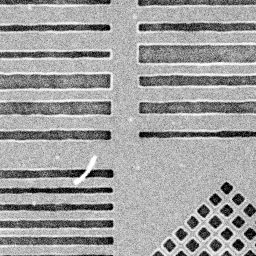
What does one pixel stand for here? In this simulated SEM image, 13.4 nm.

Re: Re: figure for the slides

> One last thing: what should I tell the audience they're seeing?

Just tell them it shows groups of lines, slits or small figures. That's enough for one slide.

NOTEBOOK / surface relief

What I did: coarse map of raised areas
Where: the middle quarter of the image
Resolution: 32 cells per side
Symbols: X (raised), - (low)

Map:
XXXXXXXXXXXXXXXXXXXXXXXXXXXXXXXX
XXXXXXXXXXXXXXXXXXXXXXXXXXXXXXXX
------------XXXXXXXXXXXXXXX--XXX
------------XXXXXXX-------------
------------XXXXXXX-------------
------------XXXXXXX-------------
XXXXXXXXXXXXXXXXXXXXXXXXXXXXXXXX
XXXXXXXXXXXXXXXXXXXXXXXXXXXXXXXX
XXXXXXXXXXXXXXXXXXXXXXXXXXXXXXXX
------------XXXXXXX-------------
------------XXXXXX--------------
------------XXXXXXX-------------
------------XXXXXXX-------------
XXXXXXXXXXXXXXXXXXXXXXXXXXXXXXXX
XXXXXXXXXXXXXXXXXXXXXXXXXXXXXXXX
XXXXXXXXXXXXXXXXXXXXXXXXXXXXXXXX
-----------XXXXXXXXXXXXXXXXXXXXX
------------XXXXXXX-------------
------------XXXXXXX-------------
XXXXXXXXXXXXXXXXXXXXXXXXXXXXXXXX
XXXXXXXXXXXXXXXXXXXXXXXXXXXXXXXX
XXXXXXXXXXXXXXXXXXXXXXXXXXXXXXXX
XXXXXXXXXXXXXXXXXXXXXXXXXXXXXXXX
XXXXXXXXXXXXXXXXXXXXXXXXXXXXXXXX
XXXXXXXXXXXXXXXXXXXXXXXXXXXXXXXX
XXXXXXXXXXXXXXXXXXXXXXXXXXXXXXXX
-----XX-----XXXXXXXXXXXXXXXXXXXX
-----X------XXXXXXXXXXXXXXXXXXXX
----XX-XX---XXXXXXXXXXXXXXXXXXXX
XXXXXXXXXXXXXXXXXXXXXXXXXXXXXXXX
XXXXXXXXXXXXXXXXXXXXXXXXXXXXXXXX
------------XXXXXXXXXXXXXXXXXXXX